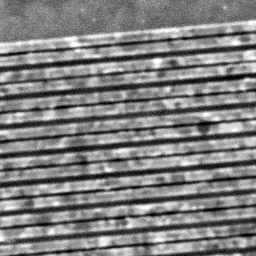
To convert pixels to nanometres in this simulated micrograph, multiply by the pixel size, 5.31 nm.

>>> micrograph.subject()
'parallel lines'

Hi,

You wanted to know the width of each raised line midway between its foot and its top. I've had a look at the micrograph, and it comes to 0.0476 microns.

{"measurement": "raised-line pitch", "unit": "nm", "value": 76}